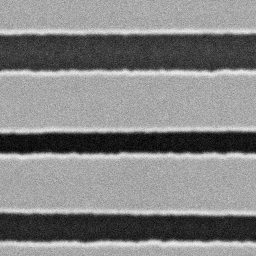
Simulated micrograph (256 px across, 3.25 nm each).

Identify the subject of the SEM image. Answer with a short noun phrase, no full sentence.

lines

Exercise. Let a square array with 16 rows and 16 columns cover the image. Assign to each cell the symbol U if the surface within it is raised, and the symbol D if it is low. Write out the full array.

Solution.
UUUUUUUUUUUUUUUU
UUUUUUUUUUUUUUUU
DDDDDDDDDDDDDDDD
DDDDDDDDDDDDDDDD
UUUUUUUUUUUUUUUU
UUUUUUUUUUUUUUUU
UUUUUUUUUUUUUUUU
UUUUUUUUUUUUUUUU
DDDDDDDDDDDDDDDD
DDDDDDDDDDDDDDDD
UUUUUUUUUUUUUUUU
UUUUUUUUUUUUUUUU
UUUUUUUUUUUUUUUU
DDDDDDDDDDDDDDDD
DDDDDDDDDDDDDDDD
UUUUUUUUUUUUUUUU